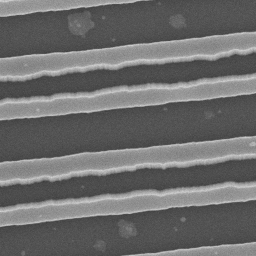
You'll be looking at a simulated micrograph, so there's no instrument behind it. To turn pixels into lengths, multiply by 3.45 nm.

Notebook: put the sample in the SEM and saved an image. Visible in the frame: lines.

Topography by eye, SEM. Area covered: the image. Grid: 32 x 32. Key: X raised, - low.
XXXXXXXXXXXXXX------------------
XXXX----------------------------
--------------------------------
--------------------------------
---------------------------XXXXX
-------------------XXXXXXXXXXXXX
---------XXXXXXXXXXXXXXXXXXXX-X-
XXXXXXXXXXXXXXXXXXXXXX----------
XXXXXXXXXXX---------------------
XXXX---------------------------X
------------------------XXXXXXXX
------------XXXXXXXXXXXXXXXXXXXX
---XXXXXXXXXXXXXXXXXXXXX--------
XXXXXXXXXXXXXX------------------
XXXXX---------------------------
--------------------------------
--------------------------------
----------------------------XXXX
------------------XXXXXXXXXXXXXX
--------XXXXXXXXXXXXXXXXXXXXXXXX
XXXXXXXXXXXXXXXXXXXXXXXX--------
XXXXXXXXXXXXX-------------------
XXXX----------------------------
--------------------------XXXXXX
---------------XXXXXXXXXXXXXXXXX
-----XXXXXXXXXXXXXXXXXXXXXX-----
XXXXXXXXXXXXXXXXX---------------
XXXXXXX-------------------------
--------------------------------
--------------------------------
------------------------------XX
--------------------XXXXXXXXXXXX